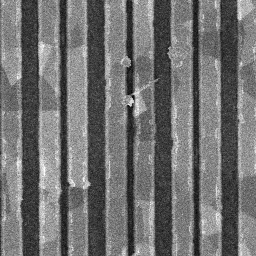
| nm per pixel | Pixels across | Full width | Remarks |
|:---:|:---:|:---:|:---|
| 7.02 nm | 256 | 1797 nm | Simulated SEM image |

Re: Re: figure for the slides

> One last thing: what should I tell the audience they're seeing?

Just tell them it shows parallel lines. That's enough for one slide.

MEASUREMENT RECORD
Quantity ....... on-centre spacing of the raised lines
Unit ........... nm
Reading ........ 233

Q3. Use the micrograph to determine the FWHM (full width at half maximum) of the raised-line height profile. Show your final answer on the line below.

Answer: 0.13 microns